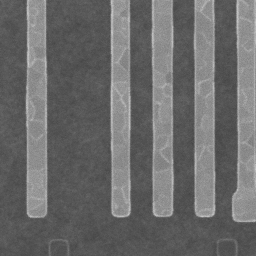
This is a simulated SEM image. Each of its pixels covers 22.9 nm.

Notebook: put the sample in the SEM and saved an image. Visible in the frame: wiring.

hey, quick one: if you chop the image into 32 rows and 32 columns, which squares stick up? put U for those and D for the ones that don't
DDDUUUDDDDDDDDUUDDDUUDDDUUUDDDUU
DDDUUUDDDDDDDDUUDDDUUDDDUUUDDDUU
DDDUUUDDDDDDDDUUDDDUUDDDUUUDDDUU
DDDDUUDDDDDDDDUUDDDUUDDDUUUDDDUU
DDDDUUDDDDDDDDUUDDDUUDDDUUUDDDUU
DDDDUUDDDDDDDDUUDDDUUDDDUUUDDDUU
DDDDUUDDDDDDDDUUDDDUUDDDUUUDDDUU
DDDDUUDDDDDDDDUUDDDUUDDDUUUDDDUU
DDDUUUDDDDDDDDUUDDDUUDDDUUUDDDUU
DDDUUUDDDDDDDDUUDDDUUDDDUUUDDDUU
DDDUUUDDDDDDDDUUDDDUUDDDUUUDDDUU
DDDUUUDDDDDDDDUUDDDUUDDDUUUDDDUU
DDDUUUDDDDDDDDUUDDDUUDDDUUUDDDUU
DDDUUUDDDDDDDDUUDDDUUDDDUUUDDDUU
DDDUUUDDDDDDDDUUDDDUUDDDUUUDDDUU
DDDUUUDDDDDDDDUUDDDUUDDDUUUDDDUU
DDDUUUDDDDDDDDUUDDDUUDDDUUUDDDUU
DDDUUUDDDDDDDDUUDDDUUDDDUUUDDDUU
DDDUUUDDDDDDDDUUDDDUUDDDUUUDDDUU
DDDUUUDDDDDDDDUUDDDUUDDDUUUDDDUU
DDDUUUDDDDDDDDUUDDDUUDDDUUUDDDUU
DDDUUUDDDDDDDDUUDDDUUUDDUUUDDDUU
DDDUUUDDDDDDDDUUDDDUUUDDUUUDDDUU
DDDUUUDDDDDDDDUUDDDUUUDDUUUDDDUU
DDDUUUDDDDDDDDUUDDDUUDDDUUUDDUUU
DDDUUUDDDDDDDDUUDDDUUDDDUUUDDUUU
DDDUUUDDDDDDDDUUDDDUUDDDDUUDDUUU
DDDDDDDDDDDDDDDDDDDDDDDDDDDDDUUU
DDDDDDDDDDDDDDDDDDDDDDDDDDDDDDDD
DDDDDDDDDDDDDDDDDDDDDDDDDDDDDDDD
DDDDDDUUDDDDDDDDDDDDDDDDDDDUUUDD
DDDDDDUUUDDDDDDDDDDDDDDDDDDUUUDD